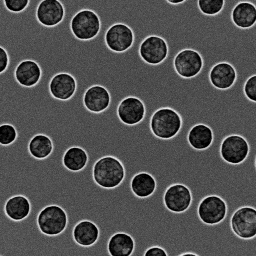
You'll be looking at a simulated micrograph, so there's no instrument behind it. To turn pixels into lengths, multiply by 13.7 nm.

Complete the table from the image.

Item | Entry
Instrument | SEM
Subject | a regular array of holes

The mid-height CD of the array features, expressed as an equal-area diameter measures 0.352 um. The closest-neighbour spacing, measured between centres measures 497 nm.